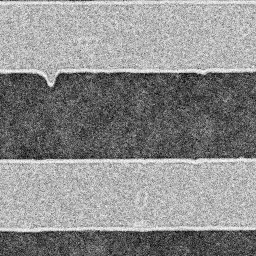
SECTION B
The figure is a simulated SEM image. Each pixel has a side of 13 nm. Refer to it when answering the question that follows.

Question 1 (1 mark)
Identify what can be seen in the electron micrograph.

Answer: one or a few lines or trenches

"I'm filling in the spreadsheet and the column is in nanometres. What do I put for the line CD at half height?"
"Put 880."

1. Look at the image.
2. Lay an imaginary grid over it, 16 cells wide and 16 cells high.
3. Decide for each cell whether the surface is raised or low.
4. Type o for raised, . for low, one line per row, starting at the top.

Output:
oooooooooooooooo
oooooooooooooooo
oooooooooooooooo
oooooooooooooooo
..oo............
................
................
................
................
................
oooooooooooooooo
oooooooooooooooo
oooooooooooooooo
oooooooooooooooo
................
................